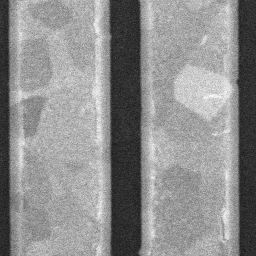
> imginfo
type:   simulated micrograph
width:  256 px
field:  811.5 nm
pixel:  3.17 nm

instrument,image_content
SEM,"one or a few lines or trenches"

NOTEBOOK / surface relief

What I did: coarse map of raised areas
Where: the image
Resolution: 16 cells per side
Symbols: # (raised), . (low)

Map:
.#####...#####..
.#####...#####..
.######..#####..
.#####...#####..
.#####...#####..
.#####...#####..
.######..######.
.######..######.
.######..######.
.######..######.
.######..######.
.######..######.
.######..######.
.######..######.
.######..######.
.######..######.